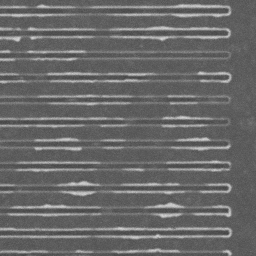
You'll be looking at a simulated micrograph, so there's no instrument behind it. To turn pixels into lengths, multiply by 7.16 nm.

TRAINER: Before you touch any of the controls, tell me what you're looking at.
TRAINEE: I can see parallel lines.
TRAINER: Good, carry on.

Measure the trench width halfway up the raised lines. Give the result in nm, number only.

34.9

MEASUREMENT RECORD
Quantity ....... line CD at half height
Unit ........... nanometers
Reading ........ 120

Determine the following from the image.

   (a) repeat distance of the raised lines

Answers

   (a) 159 nanometres